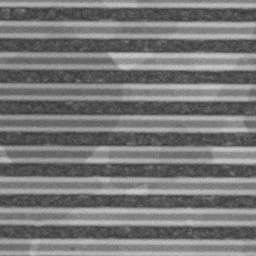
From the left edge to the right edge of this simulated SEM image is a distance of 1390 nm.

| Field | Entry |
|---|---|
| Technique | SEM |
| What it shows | parallel lines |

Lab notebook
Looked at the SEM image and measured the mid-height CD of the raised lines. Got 64.5 nanometres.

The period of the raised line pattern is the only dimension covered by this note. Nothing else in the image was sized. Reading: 169 nm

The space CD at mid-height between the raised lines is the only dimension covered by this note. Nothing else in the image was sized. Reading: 104 nm